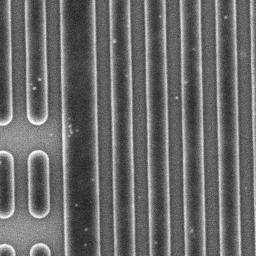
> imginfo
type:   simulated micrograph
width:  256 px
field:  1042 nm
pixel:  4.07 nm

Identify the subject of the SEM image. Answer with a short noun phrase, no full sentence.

groups of lines, slits or small figures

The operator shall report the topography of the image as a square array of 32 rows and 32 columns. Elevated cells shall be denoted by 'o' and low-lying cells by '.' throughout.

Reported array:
o..ooo..oooo..oo..ooo..oo..oo..o
o..ooo..oooo..oo..ooo..oo..oo..o
o..ooo..oooo..oo..ooo..oo..oo..o
o..ooo..oooo..oo..ooo..oo..oo..o
o..ooo..oooo..oo..ooo..oo..ooo.o
o..ooo..oooo..oo..ooo..oo..ooo.o
o..ooo..oooo..oo..ooo..oo..ooo.o
o..ooo..oooo..oo..ooo..oo..ooo.o
o..ooo..oooo..oo..ooo..oo..ooo.o
o..ooo..oooo..oo..ooo..oo..ooo.o
o..ooo..oooo..oo..ooo..oo..ooo..
o..ooo..oooo..oo..ooo..oo..ooo..
o..ooo..oooo..oo..ooo..oo..ooo..
o..ooo..oooo..oo..ooo..oo..ooo..
o...oo..oooo..oo...oo..oo..ooo..
o.......oooo..oo...oo..oo..ooo..
........oooo..ooo..oo..oo..ooo..
........oooo..ooo..oo..oo..ooo..
........oooo..ooo..oo..oo..ooo..
o...oo..oooo..ooo..oo..oo..ooo..
oo..oo..oooo..ooo..oo..oo..ooo..
oo..oo..oooo..ooo..oo..oo..ooo..
oo..oo..oooo..ooo..oo..oo..ooo..
oo..oo..oooo..ooo..oo..oo..ooo..
oo..oo..oooo..ooo..oo..oo...oo..
oo..oo..oooo..ooo..oo..oo...oo..
oo..oo..oooo..ooo..oo..ooo..oo..
........oooo..ooo..oo..ooo..oo..
........oooo..ooo..oo..ooo..oo..
........oooo..ooo..oo..ooo..oo..
........oooo..ooo..oo..ooo..oo..
oo..oo..oooo..ooo..oo..ooo..oo..